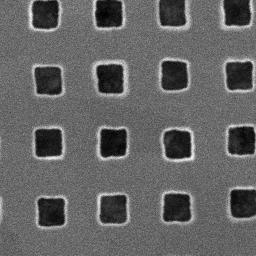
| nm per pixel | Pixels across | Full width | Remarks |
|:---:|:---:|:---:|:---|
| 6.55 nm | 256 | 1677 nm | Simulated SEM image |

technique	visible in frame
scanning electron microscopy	a regular array of holes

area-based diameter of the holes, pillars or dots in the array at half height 0.204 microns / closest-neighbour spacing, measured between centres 412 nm